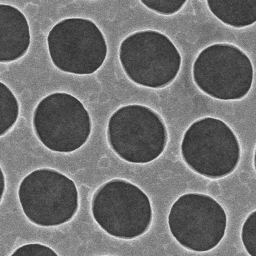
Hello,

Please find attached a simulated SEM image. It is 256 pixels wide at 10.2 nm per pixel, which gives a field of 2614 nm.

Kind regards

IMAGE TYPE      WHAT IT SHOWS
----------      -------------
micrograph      a regular array of holes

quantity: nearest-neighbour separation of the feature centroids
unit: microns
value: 0.763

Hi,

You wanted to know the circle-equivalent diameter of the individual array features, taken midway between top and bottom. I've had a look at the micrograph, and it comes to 590 nm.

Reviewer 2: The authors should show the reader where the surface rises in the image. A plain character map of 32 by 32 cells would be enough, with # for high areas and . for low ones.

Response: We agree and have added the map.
##################.....###......
...#################..#####.....
...#####...#################....
....###.....####################
....##.......###.....###########
....##.......##.......##########
...###.......##.......###.....##
..####.......##........##......#
#######.....###.......##........
################......##........
##################...####......#
.#########################.....#
..###.....######################
..###......####...##############
..##.......###......############
..##.......###......####....####
.####......###.......##......###
#####......###.......##.......##
######....####......###.......##
###############.....###.......##
########################......##
####...##################....###
.##......#####.#################
##.......####....###############
##........##......#####...######
###.......##.......###.....#####
###......###.......##.......####
####.....###.......##.......###.
#############.....###.......##..
##############...#####......##..
####.##################....###..
##.....########################.